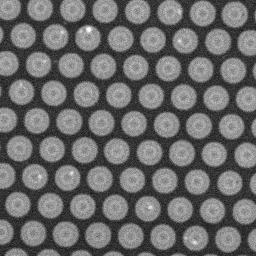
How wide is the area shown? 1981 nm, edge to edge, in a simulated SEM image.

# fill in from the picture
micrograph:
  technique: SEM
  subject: an array of small figures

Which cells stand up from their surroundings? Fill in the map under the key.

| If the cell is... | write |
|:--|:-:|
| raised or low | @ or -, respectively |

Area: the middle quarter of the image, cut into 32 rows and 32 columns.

@@@@@--@@@@@@--@@@@@@--@@@@@@--@
@@@@@--@@@@@@--@@@@@@--@@@@@@--@
@@@@---@@@@@---@@@@@@--@@@@@@--@
--------@@@-----@@@@----@@@@----
--------------------------------
---@@@@@---@@@@@----@@@@-----@@-
---@@@@@@--@@@@@@--@@@@@---@@@@@
---@@@@@@--@@@@@@--@@@@@@--@@@@@
---@@@@@@--@@@@@@--@@@@@@--@@@@@
---@@@@@---@@@@@---@@@@@@--@@@@@
----@@@-----@@@-----@@@@----@@@@
@@@-----------------------------
@@@@---@@@@@----@@@@----@@@-----
@@@@--@@@@@@---@@@@@---@@@@@---@
@@@@--@@@@@@---@@@@@@--@@@@@@--@
@@@@--@@@@@@--@@@@@@@--@@@@@@--@
@@@@---@@@@@---@@@@@---@@@@@@--@
-@------@@@-----@@@-----@@@@---@
-----@--------------------------
---@@@@@---@@@@-----@@@-----@@@-
--@@@@@@--@@@@@@---@@@@@---@@@@@
--@@@@@@--@@@@@@--@@@@@@--@@@@@@
--@@@@@@--@@@@@@--@@@@@@--@@@@@@
---@@@@@---@@@@@---@@@@@---@@@@@
----@@-----@@@@----@@@@@---@@@@@
@@------------------------------
@@@----@@@@----@@@@----@@@@-----
@@@@--@@@@@@--@@@@@@---@@@@@---@
@@@@--@@@@@@--@@@@@@--@@@@@@--@@
@@@@--@@@@@@--@@@@@@--@@@@@@--@@
@@@---@@@@@@--@@@@@@--@@@@@@--@@
@@-----@@@@----@@@@----@@@@----@